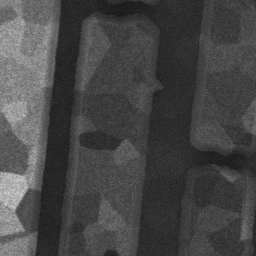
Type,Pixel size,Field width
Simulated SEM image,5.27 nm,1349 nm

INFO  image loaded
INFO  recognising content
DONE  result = one or a few lines or trenches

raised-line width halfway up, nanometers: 353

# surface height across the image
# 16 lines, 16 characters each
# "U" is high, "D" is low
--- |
UUUDDDDDDDDDDUUU
UUUDDDUUUDDDDUUU
UUUDDUUUUUDDDUUU
UUUDDUUUUUDDDUUU
UUUDDUUUUDDDDUUU
UUUDDUUUUUDDDUUU
UUUDDUUUUDDDUUUU
UUUDDUUUUDDDUUUU
UUUDDUUUUDDDUUUU
UUUDDUUUUDDDDDDD
UUDDDUUUUDDDDDDD
UUDDUUUUUDDDUUUU
UUDDUUUUUDDDUUUU
UUDDUUUUDDDDUUUU
UUDDUUUUDDDDUUUD
UUDDUUUUDDDUUUUU